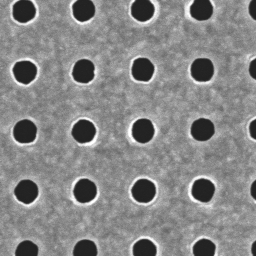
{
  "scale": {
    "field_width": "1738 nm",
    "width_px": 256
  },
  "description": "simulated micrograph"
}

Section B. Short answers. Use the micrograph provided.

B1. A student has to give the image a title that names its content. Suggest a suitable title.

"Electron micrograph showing a regular array of holes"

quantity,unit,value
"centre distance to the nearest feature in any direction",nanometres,399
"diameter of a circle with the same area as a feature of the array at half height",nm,161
